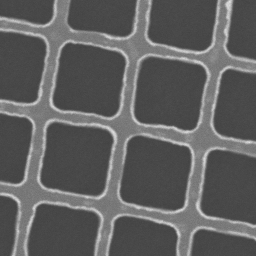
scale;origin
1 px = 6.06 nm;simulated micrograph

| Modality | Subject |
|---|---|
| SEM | holes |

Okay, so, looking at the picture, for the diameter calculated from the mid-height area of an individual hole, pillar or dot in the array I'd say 453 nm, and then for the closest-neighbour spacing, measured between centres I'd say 486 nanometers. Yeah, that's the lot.